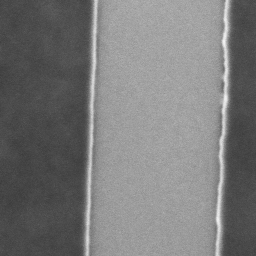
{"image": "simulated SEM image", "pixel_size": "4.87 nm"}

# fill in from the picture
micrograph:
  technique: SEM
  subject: one or a few lines or trenches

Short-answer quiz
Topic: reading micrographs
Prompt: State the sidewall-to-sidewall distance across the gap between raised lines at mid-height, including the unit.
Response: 0.628 microns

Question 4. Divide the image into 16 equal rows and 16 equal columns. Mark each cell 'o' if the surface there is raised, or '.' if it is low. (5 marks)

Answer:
oooooo........oo
oooooo........oo
oooooo........oo
oooooo........oo
oooooo........oo
oooooo........oo
oooooo........oo
oooooo........oo
oooooo........oo
oooooo........oo
oooooo........oo
oooooo........oo
oooooo........oo
oooooo........oo
oooooo........oo
oooooo........oo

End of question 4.